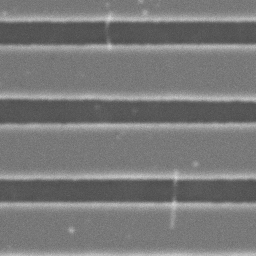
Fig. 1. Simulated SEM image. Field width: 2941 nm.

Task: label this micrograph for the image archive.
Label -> lines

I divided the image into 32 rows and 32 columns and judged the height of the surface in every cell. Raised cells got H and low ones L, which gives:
HHHHHHHHHHHHHHHHHHHHHHHHHHHHHHHH
HHHHHHHHHHHHHHHHHHHHHHHHHHHHHHHH
HHHHHHHHHHHHHHHHHHHHHHHHHHHHHHHH
LLLLLLLLLLLLLLLLLLLLLLLLLLLLLLLL
LLLLLLLLLLLLLLLLLLLLLLLLLLLLLLLL
LLLLLLLLLLLLLLLLLLLLLLLLLLLLLLLL
HHHHHHHHHHHHHHHHHHHHHHHHHHHHHHHH
HHHHHHHHHHHHHHHHHHHHHHHHHHHHHHHH
HHHHHHHHHHHHHHHHHHHHHHHHHHHHHHHH
HHHHHHHHHHHHHHHHHHHHHHHHHHHHHHHH
HHHHHHHHHHHHHHHHHHHHHHHHHHHHHHHH
HHHHHHHHHHHHHHHHHHHHHHHHHHHHHHHH
LLLLLLLLLLLLLLLLLLLLLLLLLLHHHLHH
LLLLLLLLLLLLLLLLLLLLLLLLLLLLLLLL
LLLLLLLLLLLLLLLLLLLLLLLLLLLLLLLL
LLLLLLLLLLLLLLLLLLLLLLLLLLHLHHHL
HHHHHHHHHHHHHHHHHHHHHHHHHHHHHHHH
HHHHHHHHHHHHHHHHHHHHHHHHHHHHHHHH
HHHHHHHHHHHHHHHHHHHHHHHHHHHHHHHH
HHHHHHHHHHHHHHHHHHHHHHHHHHHHHHHH
HHHHHHHHHHHHHHHHHHHHHHHHHHHHHHHH
HHHHHHHHHHHHHHHHHHHHHHHHHHHHHHHH
LLLLLLLLLLLLLLLLLLLLLLLLLLLLLLLL
LLLLLLLLLLLLLLLLLLLLLLLLLLLLLLLL
LLLLLLLLLLLLLLLLLLLLLLLLLLLLLLLL
HHHHHHHHHHHHHHHHHHHHHHHHHHHHHHHH
HHHHHHHHHHHHHHHHHHHHHHHHHHHHHHHH
HHHHHHHHHHHHHHHHHHHHHHHHHHHHHHHH
HHHHHHHHHHHHHHHHHHHHHHHHHHHHHHHH
HHHHHHHHHHHHHHHHHHHHHHHHHHHHHHHH
HHHHHHHHHHHHHHHHHHHHHHHHHHHHHHHH
HHHHHHHHHHHHHHHHHHHHHHHHHHHHHHHH